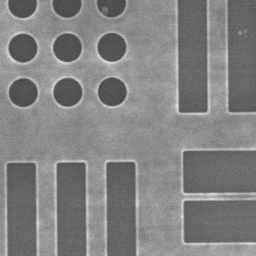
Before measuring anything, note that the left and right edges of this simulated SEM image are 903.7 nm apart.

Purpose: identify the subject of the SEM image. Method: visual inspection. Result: groups of lines, slits or small figures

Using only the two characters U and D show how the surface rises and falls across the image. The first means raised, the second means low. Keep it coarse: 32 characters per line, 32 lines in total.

UDDDDUUDDDUUDDDDUUUUUUDDDDUUDDDD
UDDDUUUDDDUUUDDUUUUUUUDDDDUUDDDD
UUUUUUUUUUUUUUUUUUUUUUDDDDUUDDDD
UUUUUUUUUUUUUUUUUUUUUUDDDDUUDDDD
UUDDUUUDDDUUUDDUUUUUUUDDDDUUDDDD
UDDDDUUDDDUUDDDDUUUUUUDDDDUUDDDD
UDDDDUUDDDUUDDDDUUUUUUDDDDUUDDDD
UUDDUUUUDUUUUDDUUUUUUUDDDDUUDDDD
UUUUUUUUUUUUUUUUUUUUUUDDDDUUDDDD
UUUUUUUUUUUUUUUUUUUUUUDDDDUUDDDD
UDDDUUUDDDUUUDDDUUUUUUDDDDUUDDDD
UDDDDUUDDDUUDDDDUUUUUUDDDDUUDDDD
UDDDUUUDDDUUUDDDUUUUUUDDDDUUDDDD
UUUUUUUUUUUUUUUUUUUUUUDDDDUUUDDD
UUUUUUUUUUUUUUUUUUUUUUUUUUUUUUUU
UUUUUUUUUUUUUUUUUUUUUUUUUUUUUUUU
UUUUUUUUUUUUUUUUUUUUUUUUUUUUUUUU
UUUUUUUUUUUUUUUUUUUUUUUUUUUUUUUU
UUUUUUUUUUUUUUUUUUUUUUUUUUUUUUUU
UUUUUUUUUUUUUUUUUUUUUUUDDDDDDDDD
UDDDUUUDDDDUUDDDDUUUUUUDDDDDDDDD
UDDDDUUDDDDUUDDDDUUUUUUDDDDDDDDD
UDDDDUUDDDDUUDDDDUUUUUUDDDDDDDDD
UDDDDUUDDDDUUDDDDUUUUUUDDDDDDDDD
UDDDDUUDDDDUUDDDDUUUUUUUUUUUUUUU
UDDDDUUDDDDUUDDDDUUUUUUDDDDDDDDD
UDDDDUUDDDDUUDDDDUUUUUUDDDDDDDDD
UDDDDUUDDDDUUDDDDUUUUUUDDDDDDDDD
UDDDDUUDDDDUUDDDDUUUUUUDDDDDDDDD
UDDDDUUDDDDUUDDDDUUUUUUDDDDDDDDD
UDDDDUUDDDDUUDDDDUUUUUUUUUUUUUUU
UDDDDUUDDDDUUDDDDUUUUUUUUUUUUUUU